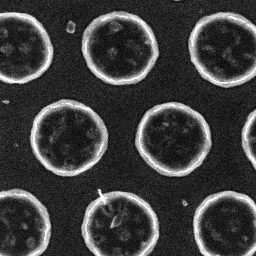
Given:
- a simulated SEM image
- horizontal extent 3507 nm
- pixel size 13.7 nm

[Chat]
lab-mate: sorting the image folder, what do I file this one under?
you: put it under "raised bodies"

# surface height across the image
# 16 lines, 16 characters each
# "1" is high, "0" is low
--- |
0000000000000000
1100001110000111
1110011111001111
1110011111001111
1100001110000111
0000000000000000
0000100000000000
0011110001111000
0011111001111001
0011110001111000
0001100000110000
0000000000000000
1100001110000110
1110011111001111
1110011111001111
1110001110000111